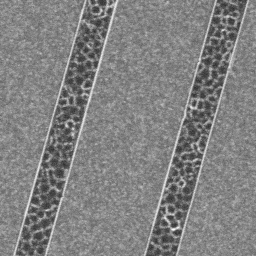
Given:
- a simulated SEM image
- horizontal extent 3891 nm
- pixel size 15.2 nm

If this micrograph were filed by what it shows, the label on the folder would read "one or a few lines or trenches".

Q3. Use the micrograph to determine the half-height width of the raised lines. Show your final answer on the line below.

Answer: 464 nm